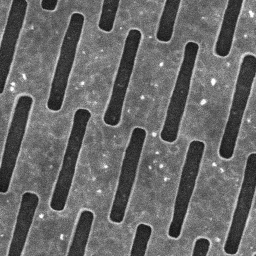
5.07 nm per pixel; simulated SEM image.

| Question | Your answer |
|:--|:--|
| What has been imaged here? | holes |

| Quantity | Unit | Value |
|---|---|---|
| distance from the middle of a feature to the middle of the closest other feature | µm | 0.302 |